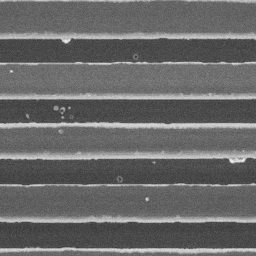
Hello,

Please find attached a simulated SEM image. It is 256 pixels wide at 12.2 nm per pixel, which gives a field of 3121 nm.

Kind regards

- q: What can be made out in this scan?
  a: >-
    lines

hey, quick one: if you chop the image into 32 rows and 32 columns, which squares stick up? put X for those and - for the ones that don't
XXXXXXXXXXXXXXXXXXXXXXXXXXXXXXXX
XXXXXXXXXXXXXXXXXXXXXXXXXXXXXXXX
XXXXXXXXXXXXXXXXXXXXXXXXXXXXXXXX
XXXXXXXXXXXXXXXXXXXXXXXXXXXXXXXX
XXXXXXXXXXXXXXXXXXXXXXXXXXXXXXXX
--------------------------------
--------------------------------
--------------------------------
XXXXXXXXXXXXXXXXXXXXXXXXXXXXXXXX
XXXXXXXXXXXXXXXXXXXXXXXXXXXXXXXX
XXXXXXXXXXXXXXXXXXXXXXXXXXXXXXXX
XXXXXXXXXXXXXXXXXXXXXXXXXXXXXXXX
--------------------------------
--------------------------------
--------------------------------
--------------------------------
XXXXXXXXXXXXXXXXXXXXXXXXXXXXXXXX
XXXXXXXXXXXXXXXXXXXXXXXXXXXXXXXX
XXXXXXXXXXXXXXXXXXXXXXXXXXXXXXXX
XXXXXXXXXXXXXXXXXXXXXXXXXXXXXXXX
--------------------------------
--------------------------------
--------------------------------
XXXXXXXXXXXXXXXXXXXXXXXXXXXXXXXX
XXXXXXXXXXXXXXXXXXXXXXXXXXXXXXXX
XXXXXXXXXXXXXXXXXXXXXXXXXXXXXXXX
XXXXXXXXXXXXXXXXXXXXXXXXXXXXXXXX
XXXXXXXXXXXXXXXXXXXXXXXXXXXXXXXX
--------------------------------
--------------------------------
--------------------------------
XXXXXXXXXXXXXXXXXXXXXXXXXXXXXXXX